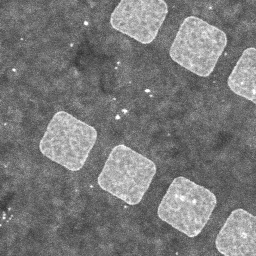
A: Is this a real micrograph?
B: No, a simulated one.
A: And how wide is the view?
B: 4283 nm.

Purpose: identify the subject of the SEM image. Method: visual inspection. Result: raised bodies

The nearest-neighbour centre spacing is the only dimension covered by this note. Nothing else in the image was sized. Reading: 1130 nm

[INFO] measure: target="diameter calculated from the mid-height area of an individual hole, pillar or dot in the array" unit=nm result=890